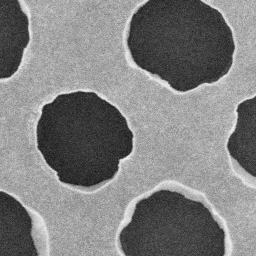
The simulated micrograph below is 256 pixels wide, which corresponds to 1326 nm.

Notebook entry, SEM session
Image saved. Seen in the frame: holes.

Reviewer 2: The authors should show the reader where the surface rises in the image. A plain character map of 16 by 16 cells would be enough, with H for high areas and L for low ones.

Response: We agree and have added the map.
LHHHHHHHHLLLLHHH
LLHHHHHHLLLLLLHH
LLHHHHHHLLLLLLLH
LHHHHHHHLLLLLLLH
LHHHHHHHHLLLLLHH
HHHHHHHHHHHLHHHH
HHHLLLLHHHHHHHHL
HHLLLLLLHHHHHHHL
HHLLLLLLHHHHHHLL
HHHLLLLLHHHHHHLL
HHHLLLLHHHHHHHHL
HHHHLLLHHHHHHHHH
LHHHHHHHHLLLLHHH
LLHHHHHHLLLLLLHH
LLHHHHHHLLLLLLHH
LLLHHHHLLLLLLLHH